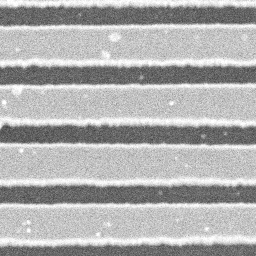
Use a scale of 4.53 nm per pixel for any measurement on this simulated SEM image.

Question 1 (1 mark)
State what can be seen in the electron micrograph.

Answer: lines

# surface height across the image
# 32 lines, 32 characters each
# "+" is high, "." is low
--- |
++++++++++++++++++++++++++++++++
................................
................................
++++++++++++++++++++++++++++++++
++++++++++++++++++++++++++++++++
++++++++++++++++++++++++++++++++
++++++++++++++++++++++++++++++++
++++++++++++++++++++++++++++++++
................................
................................
................................
++++++++++++++++++++++++++++++++
++++++++++++++++++++++++++++++++
++++++++++++++++++++++++++++++++
++++++++++++++++++++++++++++++++
++++++++.++++++++++.++++++++++++
................................
................................
++++++++++++++++++++++++++++++++
++++++++++++++++++++++++++++++++
++++++++++++++++++++++++++++++++
++++++++++++++++++++++++++++++++
++++++++++++++++++++++++++++++++
................................
................................
+.......+..+.+++..+++.+++..+++++
++++++++++++++++++++++++++++++++
++++++++++++++++++++++++++++++++
++++++++++++++++++++++++++++++++
++++++++++++++++++++++++++++++++
+++++++++++++++++.++.++.........
................................